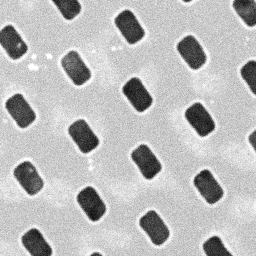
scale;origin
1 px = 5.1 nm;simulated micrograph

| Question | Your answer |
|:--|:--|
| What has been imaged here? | a regular array of holes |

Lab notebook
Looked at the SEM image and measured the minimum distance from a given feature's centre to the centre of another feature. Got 343 nm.